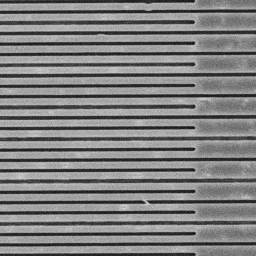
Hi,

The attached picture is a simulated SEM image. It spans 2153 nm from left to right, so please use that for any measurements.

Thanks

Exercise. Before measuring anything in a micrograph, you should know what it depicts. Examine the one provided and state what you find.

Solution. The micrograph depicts parallel lines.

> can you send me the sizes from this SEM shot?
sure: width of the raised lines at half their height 6.87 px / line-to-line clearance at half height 29.4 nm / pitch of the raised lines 0.0889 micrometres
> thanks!